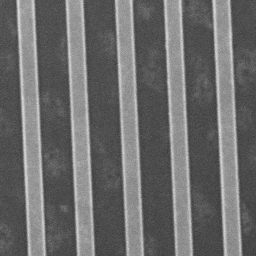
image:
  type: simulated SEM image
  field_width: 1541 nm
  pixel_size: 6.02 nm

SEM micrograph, parallel lines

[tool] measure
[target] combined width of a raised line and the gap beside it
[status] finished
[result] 294 nanometres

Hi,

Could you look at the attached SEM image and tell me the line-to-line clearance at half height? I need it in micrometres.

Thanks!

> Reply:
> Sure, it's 0.203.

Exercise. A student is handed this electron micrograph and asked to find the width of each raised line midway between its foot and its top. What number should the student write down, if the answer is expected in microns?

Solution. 0.0909